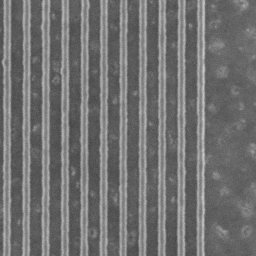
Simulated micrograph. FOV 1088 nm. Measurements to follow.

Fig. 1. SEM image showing parallel lines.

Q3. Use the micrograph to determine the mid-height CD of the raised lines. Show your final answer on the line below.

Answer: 27.1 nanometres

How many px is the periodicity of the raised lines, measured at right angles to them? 19.4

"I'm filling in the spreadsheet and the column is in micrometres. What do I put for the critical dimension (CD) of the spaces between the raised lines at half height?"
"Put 0.0548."